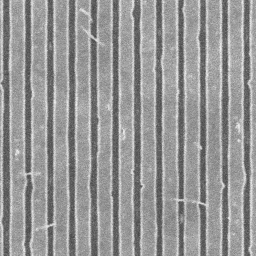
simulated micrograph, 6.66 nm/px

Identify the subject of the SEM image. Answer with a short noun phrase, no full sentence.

parallel lines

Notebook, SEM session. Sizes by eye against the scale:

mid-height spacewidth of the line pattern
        0.0532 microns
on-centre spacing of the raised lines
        146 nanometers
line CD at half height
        94.9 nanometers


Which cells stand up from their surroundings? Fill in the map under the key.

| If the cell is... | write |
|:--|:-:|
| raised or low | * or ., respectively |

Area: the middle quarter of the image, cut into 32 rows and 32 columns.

*..***...***..***..****..***..**
*..***...***..***..****..***..**
*..***...***..***..****..***..**
*..***...***..***..****..***..**
*..***...***..***..****..***..**
*..***...***..***..****..***..**
*..***...***..***..****..***..**
*..***...***..***..****..***...*
*..***...***..***..****..***...*
*..***...***..***..****..***..**
*..***...***..***..****..***..**
*..***...***..***...***..***..**
*..***...***..***..****..***..**
*..***...***..***..****..***..**
*..***...***..***...***..***..**
*..***...***..***..****..***..**
*..***...***..***..****..***...*
*..***...***..***..****..***...*
*..***...***..***..****..***...*
*..****..***..***..****..***..**
*..****..***..***...***..***..**
*..****..***..***..****..***..**
*..****..***..***..****..***..**
*..****..***..***..****..***..**
*..****..***..***..****..***..**
*..****..***..***..****..***..**
*..****..***..***..****..***..**
*..****..***..***..****..***..**
*..***...***..***..****..***..**
*..***...***..***..****..***..**
*..***...***..***...***..***..**
*..***...***..***..****..***..**